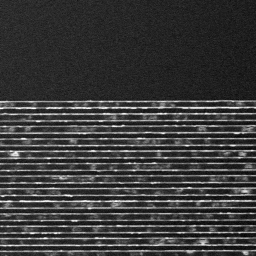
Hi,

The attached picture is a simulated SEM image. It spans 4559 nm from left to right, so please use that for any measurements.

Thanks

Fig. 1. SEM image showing parallel lines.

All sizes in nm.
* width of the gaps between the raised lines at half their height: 91.3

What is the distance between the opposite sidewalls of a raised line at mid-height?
129 nm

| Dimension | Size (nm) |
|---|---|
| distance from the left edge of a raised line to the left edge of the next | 222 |